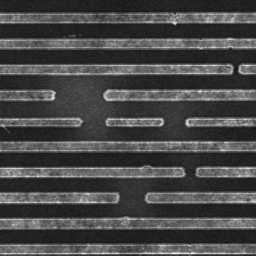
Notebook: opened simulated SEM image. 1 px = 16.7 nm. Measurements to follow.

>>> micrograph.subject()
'parallel lines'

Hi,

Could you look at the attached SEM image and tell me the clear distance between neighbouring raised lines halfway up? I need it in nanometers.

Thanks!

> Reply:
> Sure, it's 268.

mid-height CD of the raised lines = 155 nm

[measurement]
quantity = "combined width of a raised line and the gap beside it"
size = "430 nanometres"